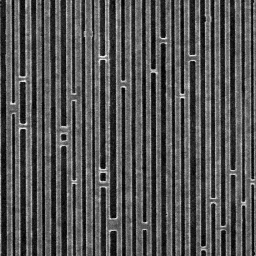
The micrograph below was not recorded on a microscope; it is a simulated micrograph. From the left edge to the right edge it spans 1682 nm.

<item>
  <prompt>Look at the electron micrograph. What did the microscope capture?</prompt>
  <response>parallel lines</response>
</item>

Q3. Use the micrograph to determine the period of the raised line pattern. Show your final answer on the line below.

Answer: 65.5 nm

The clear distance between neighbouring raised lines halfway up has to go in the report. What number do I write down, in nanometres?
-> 31.2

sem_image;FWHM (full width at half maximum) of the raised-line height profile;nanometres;31.2